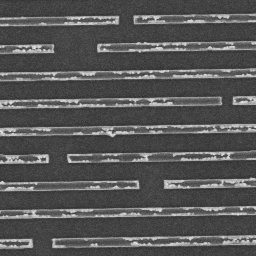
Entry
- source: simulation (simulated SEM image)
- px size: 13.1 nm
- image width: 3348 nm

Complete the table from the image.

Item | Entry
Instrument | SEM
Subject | parallel lines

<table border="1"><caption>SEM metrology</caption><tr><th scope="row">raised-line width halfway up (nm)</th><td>111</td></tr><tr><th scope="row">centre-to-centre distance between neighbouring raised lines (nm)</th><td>363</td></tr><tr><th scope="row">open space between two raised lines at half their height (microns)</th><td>0.258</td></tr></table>